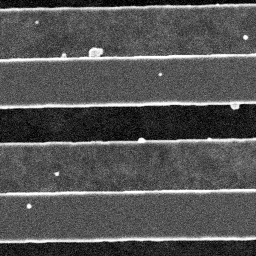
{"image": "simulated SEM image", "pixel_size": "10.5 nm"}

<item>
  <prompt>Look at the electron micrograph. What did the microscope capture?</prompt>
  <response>lines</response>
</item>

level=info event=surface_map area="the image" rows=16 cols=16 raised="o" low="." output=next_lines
.......ooooooooo
oooooooooooooooo
oooooooooooooooo
oooooooooooooooo
oooooooooooooooo
oooooooooooooooo
ooooooooooooooo.
................
................
oooooooooooooooo
oooooooooooooooo
oooooooooooooooo
oooooooooooooooo
oooooooooooooooo
oooooooooooooooo
................